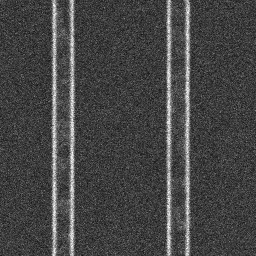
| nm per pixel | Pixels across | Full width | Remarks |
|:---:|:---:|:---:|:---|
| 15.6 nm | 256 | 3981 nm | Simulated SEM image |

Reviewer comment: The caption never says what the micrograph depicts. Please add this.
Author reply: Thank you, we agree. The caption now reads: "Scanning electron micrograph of one or a few lines or trenches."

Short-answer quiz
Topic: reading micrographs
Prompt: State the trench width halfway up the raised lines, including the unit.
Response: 1490 nm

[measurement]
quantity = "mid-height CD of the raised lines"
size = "18.6 px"